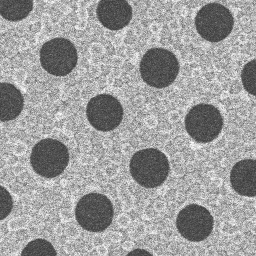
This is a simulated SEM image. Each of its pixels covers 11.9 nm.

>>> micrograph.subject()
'a regular array of holes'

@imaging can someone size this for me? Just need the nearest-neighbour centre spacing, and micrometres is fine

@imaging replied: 0.841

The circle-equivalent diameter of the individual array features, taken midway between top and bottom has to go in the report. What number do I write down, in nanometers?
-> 465